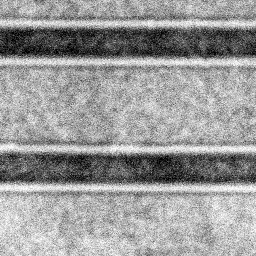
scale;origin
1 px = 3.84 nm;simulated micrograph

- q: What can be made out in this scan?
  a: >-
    one or a few lines or trenches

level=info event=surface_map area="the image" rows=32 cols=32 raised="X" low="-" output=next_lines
XXXXXXXXXXXXXXXXXXXXXXXXXXXXXXXX
XXXXXXXXXXXXXXXXXXXXXXXXXXXXXXXX
XXXXXXXXXXXXXXXXXXXXXXXXXXXXXXXX
--------------------------------
--------------------------------
--------------------------------
--------------------------------
--------------------------------
XXXXXXXXXXXXXXXXXXXXXXXXXXXXXXXX
XXXXXXXXXXXXXXXXXXXXXXXXXXXXXXXX
XXXXXXXXXXXXXXXXXXXXXXXXXXXXXXXX
XXXXXXXXXXXXXXXXXXXXXXXXXXXXXXXX
XXXXXXXXXXXXXXXXXXXXXXXXXXXXXXXX
XXXXXXXXXXXXXXXXXXXXXXXXXXXXXXXX
XXXXXXXXXXXXXXXXXXXXXXXXXXXXXXXX
XXXXXXXXXXXXXXXXXXXXXXXXXXXXXXXX
XXXXXXXXXXXXXXXXXXXXXXXXXXXXXXXX
XXXXXXXXXXXXXXXXXXXXXXXXXXXXXXXX
--XXXXXXXXXXXXXXXXXXXXXXXXXXXXXX
--------------------------------
--------------------------------
--------------------------------
--------------------------------
-XXXXXXXXXX---------------------
XXXXXXXXXXXXXXXXXXXXXXXXXXXXXXXX
XXXXXXXXXXXXXXXXXXXXXXXXXXXXXXXX
XXXXXXXXXXXXXXXXXXXXXXXXXXXXXXXX
XXXXXXXXXXXXXXXXXXXXXXXXXXXXXXXX
XXXXXXXXXXXXXXXXXXXXXXXXXXXXXXXX
XXXXXXXXXXXXXXXXXXXXXXXXXXXXXXXX
XXXXXXXXXXXXXXXXXXXXXXXXXXXXXXXX
XXXXXXXXXXXXXXXXXXXXXXXXXXXXXXXX